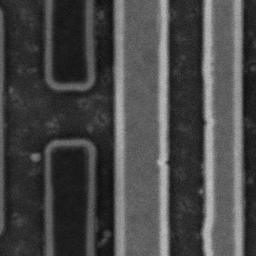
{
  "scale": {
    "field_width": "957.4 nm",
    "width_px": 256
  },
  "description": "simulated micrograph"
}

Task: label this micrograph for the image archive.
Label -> one or a few lines or trenches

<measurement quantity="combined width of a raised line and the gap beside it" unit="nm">291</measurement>